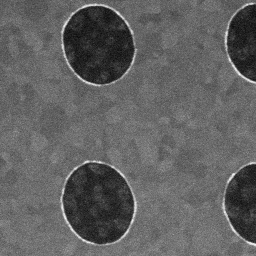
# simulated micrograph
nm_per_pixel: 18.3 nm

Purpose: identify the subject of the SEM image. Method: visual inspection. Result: holes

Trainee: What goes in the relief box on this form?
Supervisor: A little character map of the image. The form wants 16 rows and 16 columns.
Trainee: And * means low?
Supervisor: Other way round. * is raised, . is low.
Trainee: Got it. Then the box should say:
*****..********.
****....******..
****....******..
****....******..
*****...*******.
****************
****************
****************
****************
****************
*****..********.
****....******..
****....******..
****....******..
*****...*******.
****************